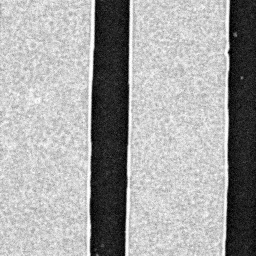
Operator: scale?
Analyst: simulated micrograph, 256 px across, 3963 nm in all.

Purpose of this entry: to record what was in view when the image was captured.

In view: one or a few lines or trenches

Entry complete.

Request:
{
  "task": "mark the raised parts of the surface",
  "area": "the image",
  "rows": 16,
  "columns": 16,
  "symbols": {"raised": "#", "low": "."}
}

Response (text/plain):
######..######..
######..######..
######..######..
######..######..
######..######..
######..######..
######..######..
######..######..
######..######..
######..######..
######..######..
######..######..
######..######..
######..######..
######..######..
######..######..